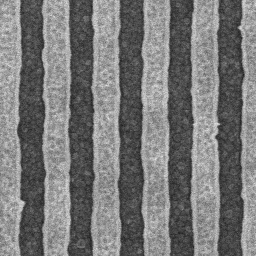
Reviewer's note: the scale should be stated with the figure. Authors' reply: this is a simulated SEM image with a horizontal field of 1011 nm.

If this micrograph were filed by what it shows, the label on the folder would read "parallel lines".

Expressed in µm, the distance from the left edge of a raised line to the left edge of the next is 0.196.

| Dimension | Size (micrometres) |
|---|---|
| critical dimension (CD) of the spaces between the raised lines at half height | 0.109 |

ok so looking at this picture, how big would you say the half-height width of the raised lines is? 85.4 nm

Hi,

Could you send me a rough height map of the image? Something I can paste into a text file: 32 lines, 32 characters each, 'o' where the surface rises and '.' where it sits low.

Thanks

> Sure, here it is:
oo....oo....ooo...ooo...ooo...oo
oo....oo....ooo...ooo...ooo...oo
oo....oo....ooo...ooo...ooo...oo
oo....oo....ooo...ooo...ooo...oo
oo....oo....ooo...ooo...ooo...oo
oo....oo....ooo...ooo...ooo...oo
oo....oo....ooo...ooo...ooo...oo
oo....ooo...ooo...ooo...ooo....o
oo....ooo...ooo...ooo...ooo....o
oo....ooo...ooo...ooo...ooo....o
oo....ooo...ooo...ooo...ooo....o
oo....ooo...ooo...ooo...ooo....o
oo....ooo...ooo...ooo...ooo....o
oo....oo....ooo...ooo...ooo...oo
oo....oo....ooo...ooo...ooo....o
oo....oo....ooo...ooo...ooo....o
oo....oo....ooo...ooo...ooo....o
oo....oo....ooo...ooo...ooo....o
oo....oo....ooo...ooo...ooo....o
oo....oo....ooo...ooo...ooo....o
oo....ooo...ooo...ooo...ooo...oo
oo....oo....ooo...ooo...ooo...oo
oo....oo....ooo...ooo...ooo...oo
oo....oo....ooo...ooo...ooo....o
oo....oo....ooo...ooo...ooo....o
ooo...oo....ooo...ooo...ooo....o
oo....oo....ooo...ooo...ooo....o
oo....ooo...ooo...ooo...ooo....o
oo....ooo...ooo...ooo...ooo....o
oo....oo....ooo...ooo...ooo....o
oo....oo....ooo...ooo...ooo....o
oo....oo....ooo...ooo....oo....o